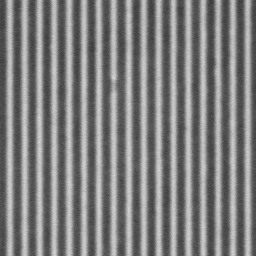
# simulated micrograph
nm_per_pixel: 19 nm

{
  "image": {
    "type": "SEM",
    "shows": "parallel lines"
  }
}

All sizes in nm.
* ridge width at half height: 73.5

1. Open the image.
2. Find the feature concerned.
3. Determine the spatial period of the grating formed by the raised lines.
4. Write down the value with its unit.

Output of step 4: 14.8 pixels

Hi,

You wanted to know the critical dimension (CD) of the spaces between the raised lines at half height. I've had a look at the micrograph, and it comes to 202 nanometres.